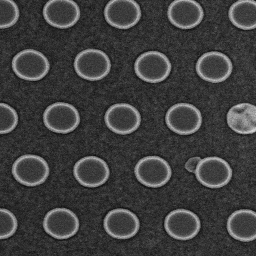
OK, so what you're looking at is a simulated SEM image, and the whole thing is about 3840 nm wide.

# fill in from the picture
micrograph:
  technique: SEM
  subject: a regular array of raised bodies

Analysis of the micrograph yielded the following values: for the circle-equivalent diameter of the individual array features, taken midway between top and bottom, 477 nanometers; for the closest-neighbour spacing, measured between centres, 0.905 micrometres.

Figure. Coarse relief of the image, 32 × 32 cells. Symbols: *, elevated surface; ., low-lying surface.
**....***.....***.....***....***
**....****...****....****....***
**....****...****....****....***
................................
................................
................................
...**.....***...................
..****...*****...****....****...
..****...*****...****....****...
...**.....***....****....***....
................................
................................
................................
*.....***.....***....***.....***
**....****...****....****....***
**....****...****....****....**.
*......*.......*......**......*.
................................
................................
................................
..****....***....****....***....
..****...*****...****....****...
..***.....***....****....****...
................................
................................
................................
*.....***.....**......**......*.
**....****...****....****....***
**....****...****....****...****
*......**.....**......**.....***
................................
................................